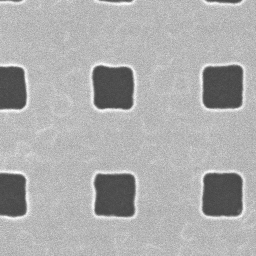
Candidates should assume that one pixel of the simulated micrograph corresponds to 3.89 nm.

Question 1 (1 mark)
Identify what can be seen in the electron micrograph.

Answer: holes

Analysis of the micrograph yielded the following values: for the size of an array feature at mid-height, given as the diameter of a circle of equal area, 179 nm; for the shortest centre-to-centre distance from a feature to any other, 0.418 microns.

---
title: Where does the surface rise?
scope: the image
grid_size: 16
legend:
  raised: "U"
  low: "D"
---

UUUUUUUUUUUUUUUU
UUUUUUUUUUUUUUUU
UUUUUUUUUUUUUUUU
UUUUUUUUUUUUUUUU
DUUUUUDDUUUUUDDU
DDUUUUDDUUUUUDDU
DDUUUUDDUUUUUDDU
UUUUUUUUUUUUUUUU
UUUUUUUUUUUUUUUU
UUUUUUUUUUUUUUUU
UUUUUUUUUUUUUUUU
DDUUUUDDUUUUUDDU
DDUUUUDDUUUUUDDU
DUUUUUUDUUUUUUUU
UUUUUUUUUUUUUUUU
UUUUUUUUUUUUUUUU